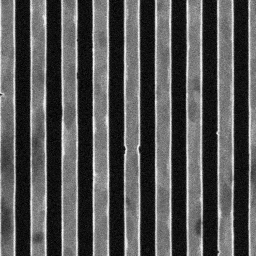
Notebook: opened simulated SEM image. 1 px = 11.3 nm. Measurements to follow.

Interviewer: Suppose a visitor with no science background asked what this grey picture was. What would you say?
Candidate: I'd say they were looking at parallel lines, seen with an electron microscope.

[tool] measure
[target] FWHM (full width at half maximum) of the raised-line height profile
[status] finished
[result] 0.164 um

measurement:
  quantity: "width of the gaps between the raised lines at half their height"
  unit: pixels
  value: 16.6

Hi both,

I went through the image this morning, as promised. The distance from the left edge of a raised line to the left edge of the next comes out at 354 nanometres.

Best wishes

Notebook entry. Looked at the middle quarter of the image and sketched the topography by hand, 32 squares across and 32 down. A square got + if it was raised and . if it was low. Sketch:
+++....++++....++++....++++....+
+++....++++....++++....++++....+
+++....++++....++++....++++....+
+++....++++....++++....++++....+
+++....++++....++++....++++....+
+++....++++....++++....++++....+
+++....++++....++++....++++....+
+++....++++....++++....++++....+
+++....++++....++++....++++....+
+++....++++....++++....++++....+
+++....++++....++++....++++....+
+++....++++....++++....++++....+
+++....++++....++++....++++....+
+++....++++....++++....++++....+
+++....++++....++++....++++....+
+++....++++....++++....++++....+
+++....++++....++++....++++....+
+++....++++....++++....++++....+
+++....++++....++++....++++....+
+++....++++....++++....++++....+
+++....++++....++++....++++....+
+++....++++....+++.....+++.....+
+++....++++....++++....+++.....+
+++....++++....++++....+++.....+
+++....++++....++++....+++.....+
+++....++++....++++....++++....+
+++....++++....++++....++++....+
+++....++++....++++....++++....+
+++....++++....++++....++++....+
+++....++++....++++....++++....+
+++....++++....++++....++++....+
+++....++++....++++....++++....+